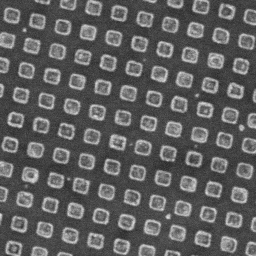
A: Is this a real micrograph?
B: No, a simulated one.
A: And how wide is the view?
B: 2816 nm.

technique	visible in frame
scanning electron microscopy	a regular array of raised bodies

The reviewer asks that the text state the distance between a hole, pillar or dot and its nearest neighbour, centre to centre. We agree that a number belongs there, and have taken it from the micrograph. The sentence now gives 276 nm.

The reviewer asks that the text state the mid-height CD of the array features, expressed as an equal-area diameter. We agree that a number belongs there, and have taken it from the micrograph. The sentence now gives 14.7 px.